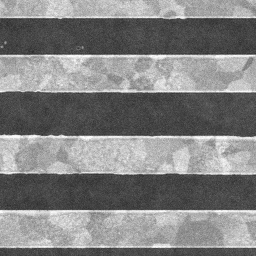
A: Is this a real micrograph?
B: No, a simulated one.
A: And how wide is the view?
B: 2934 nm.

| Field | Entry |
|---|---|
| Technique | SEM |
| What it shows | lines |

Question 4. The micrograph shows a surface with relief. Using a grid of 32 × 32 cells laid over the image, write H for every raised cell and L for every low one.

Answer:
HHHHHHHHHHHHHHHHHHHHHHHHHHHHHHHH
HHHHHHHHHHHHHHHHHHHHHHHHHHHHHHHH
LLLLLLLLLLLLLLLLLLLLLLLLLLLLLLLL
LLLLLLLLLLLLLLLLLLLLLLLLLLLLLLLL
LLLLLLLLLLLLLLLLLLLLLLLLLLLLLLLL
LLLLLLLLLLLLLLLLLLLLLLLLLLLLLLLL
LLLLLLLLLLLLLLLLLLLLLLLLLLLLLLLL
HHHHHHHHHHHHHHHHHHHHHHHHHHHHHHHH
HHHHHHHHHHHHHHHHHHHHHHHHHHHHHHHH
HHHHHHHHHHHHHHHHHHHHHHHHHHHHHHHH
HHHHHHHHHHHHHHHHHHHHHHHHHHHHHHHH
LLLLLLLLLLLLLLLLLLLLLLLLLLLLLLLL
LLLLLLLLLLLLLLLLLLLLLLLLLLLLLLLL
LLLLLLLLLLLLLLLLLLLLLLLLLLLLLLLL
LLLLLLLLLLLLLLLLLLLLLLLLLLLLLLLL
LLLLLLLLLLLLLLLLLLLLLLLLLLLLLLLL
LLLLLLLLLLLLLLLLLLLLLLLLLLLLLLLL
HHHHHHHHHHHHHHHHHHHHHHHHHHHHHHHH
HHHHHHHHHHHHHHHHHHHHHHHHHHHHHHHH
HHHHHHHHHHHHHHHHHHHHHHHHHHHHHHHH
HHHHHHHHHHHHHHHHHHHHHHHHHHHHHHHH
HHHHHHHHHHHHHHHHHHHHHHHHHHHHHHHH
LLLLLLLLLLLLLLLLLLLLLLLLLLLLLLLL
LLLLLLLLLLLLLLLLLLLLLLLLLLLLLLLL
LLLLLLLLLLLLLLLLLLLLLLLLLLLLLLLL
LLLLLLLLLLLLLLLLLLLLLLLLLLLLLLLL
HHHHHHHHHHHHHHHHHHHHHHHHHHHHHHHH
HHHHHHHHHHHHHHHHHHHHHHHHHHHHHHHH
HHHHHHHHHHHHHHHHHHHHHHHHHHHHHHHH
HHHHHHHHHHHHHHHHHHHHHHHHHHHHHHHH
HHHHHHHHHHHHHHHHHHHHHHHHHHHHHHHH
LLLLLLLLLLLLLLLLLLLLLLLLLLLLLLLL